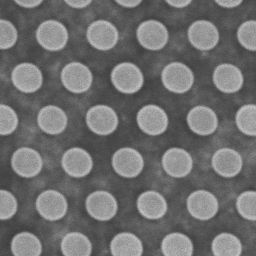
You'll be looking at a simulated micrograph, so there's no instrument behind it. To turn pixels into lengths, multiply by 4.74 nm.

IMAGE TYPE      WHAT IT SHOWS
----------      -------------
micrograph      a regular array of raised bodies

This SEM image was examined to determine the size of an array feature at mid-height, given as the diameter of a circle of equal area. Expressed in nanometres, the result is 142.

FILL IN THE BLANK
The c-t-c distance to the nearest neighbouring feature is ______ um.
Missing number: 0.233